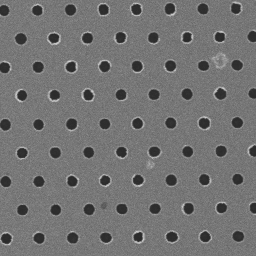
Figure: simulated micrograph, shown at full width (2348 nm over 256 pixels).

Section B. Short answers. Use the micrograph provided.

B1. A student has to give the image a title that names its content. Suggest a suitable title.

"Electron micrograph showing a regular array of holes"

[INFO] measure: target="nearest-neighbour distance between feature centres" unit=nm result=299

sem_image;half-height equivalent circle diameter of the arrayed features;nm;101